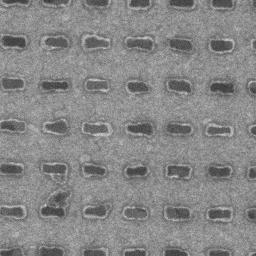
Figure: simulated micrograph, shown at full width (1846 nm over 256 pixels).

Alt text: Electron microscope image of a regular array of raised bodies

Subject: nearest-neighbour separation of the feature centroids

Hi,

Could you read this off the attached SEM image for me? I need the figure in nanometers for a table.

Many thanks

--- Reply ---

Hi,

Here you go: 290